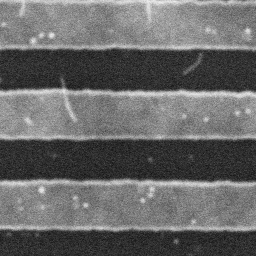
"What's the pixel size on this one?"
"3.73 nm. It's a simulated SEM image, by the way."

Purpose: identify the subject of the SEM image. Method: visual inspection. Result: lines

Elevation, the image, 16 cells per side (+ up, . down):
++++++++++++++++
++++++++++++++++
++++++++++++++++
................
................
................
++++++++++++++++
++++++++++++++++
++++++++++++++++
................
................
++++++++++++++++
++++++++++++++++
++++++++++++++++
................
................